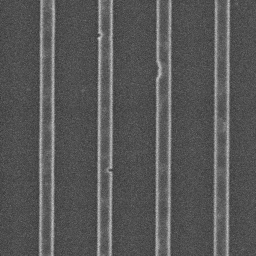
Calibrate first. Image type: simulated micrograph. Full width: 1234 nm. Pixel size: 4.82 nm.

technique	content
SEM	parallel lines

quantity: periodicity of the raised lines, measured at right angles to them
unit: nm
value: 281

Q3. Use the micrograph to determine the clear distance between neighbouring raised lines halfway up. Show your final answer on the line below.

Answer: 218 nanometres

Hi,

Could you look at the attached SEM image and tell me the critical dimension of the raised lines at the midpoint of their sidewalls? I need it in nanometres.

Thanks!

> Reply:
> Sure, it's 61.4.